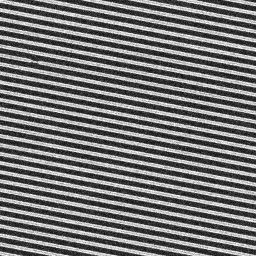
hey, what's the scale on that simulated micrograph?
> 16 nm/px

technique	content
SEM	parallel lines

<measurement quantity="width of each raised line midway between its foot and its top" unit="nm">45.1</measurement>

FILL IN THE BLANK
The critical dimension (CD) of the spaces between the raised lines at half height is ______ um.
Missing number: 0.0923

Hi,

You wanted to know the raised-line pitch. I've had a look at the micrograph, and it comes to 142 nanometers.